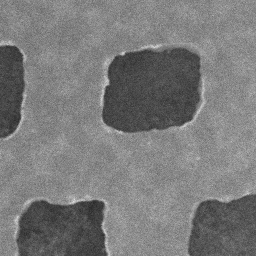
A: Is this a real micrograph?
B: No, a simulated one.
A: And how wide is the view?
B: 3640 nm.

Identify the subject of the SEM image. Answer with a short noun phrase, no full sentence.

holes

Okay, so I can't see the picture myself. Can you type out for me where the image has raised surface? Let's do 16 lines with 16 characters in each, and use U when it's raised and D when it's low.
UUUUUUUUUUUUUUUU
UUUUUUUUUUUUUUUU
UUUUUUUUUUUUUUUU
DUUUUUUDDDDDUUUU
DDUUUUUDDDDDDUUU
DUUUUUUDDDDDDUUU
DUUUUUDDDDDDDUUU
DUUUUUDDDDDDUUUU
DUUUUUUUUUUUUUUU
UUUUUUUUUUUUUUUU
UUUUUUUUUUUUUUUU
UUUUUUUUUUUUUUUU
UUUUUUUUUUUUUUUD
UDDDDDUUUUUUDDDD
UDDDDDUUUUUUDDDD
UDDDDDDUUUUUDDDD